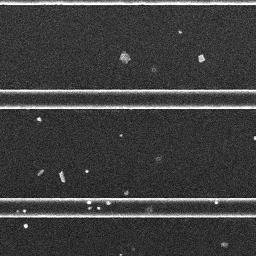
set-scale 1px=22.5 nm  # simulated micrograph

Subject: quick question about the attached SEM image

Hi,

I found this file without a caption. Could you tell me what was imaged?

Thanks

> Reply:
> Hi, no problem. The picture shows lines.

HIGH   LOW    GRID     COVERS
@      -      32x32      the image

@@@@@@@@@@@@@@@@@@@@@@@@@@@@@@@@
--------------------------------
--------------------------------
--------------------------------
--------------------------------
--------------------------------
--------------------------------
--------------------------------
--------------------------------
--------------------------------
--------------------------------
@@@@@@@@@@@@@@@@@@@@@@@@@@@@@@@@
@@@@@@@@@@@@@@@@@@@@@@@@@@@@@@@@
@@@@@@@@@@@@@@@@@@@@@@@@@@@@@@@@
--------------------------------
--------------------------------
--------------------------------
--------------------------------
--------------------------------
--------------------------------
--------------------------------
--------------------------------
--------------------------------
--------------------------------
--------------------------------
@@@@@@@@@@@@@@@@@@@@@@@@@@@@@@@@
@@@@@@@@@@@@@@@@@@@@@@@@@@@@@@@@
--------------------------------
--------------------------------
--------------------------------
--------------------------------
--------------------------------